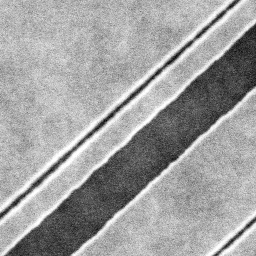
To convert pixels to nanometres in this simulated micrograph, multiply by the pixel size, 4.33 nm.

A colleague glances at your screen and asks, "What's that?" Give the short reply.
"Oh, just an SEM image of lines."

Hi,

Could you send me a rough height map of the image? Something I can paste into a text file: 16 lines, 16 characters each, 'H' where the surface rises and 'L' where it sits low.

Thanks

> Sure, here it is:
HHHHHHHHHHHHHHHH
HHHHHHHHHHHHHHHH
HHHHHHHHHHHHHHHL
HHHHHHHHHHHHHHLL
HHHHHHHHHHHHHLLL
HHHHHHHHHHHHLLLL
HHHHHHHHHHLLLLLH
HHHHHHHHHLLLLLHH
HHHHHHHHLLLLLHHH
HHHHHHHLLLLLHHHH
HHHHHHLLLLHHHHHH
HHHHHLLLLHHHHHHH
HHHHLLLLHHHHHHHH
HHHLLLLHHHHHHHHH
HHLLLLHHHHHHHHHH
HLLLLHHHHHHHHHHH